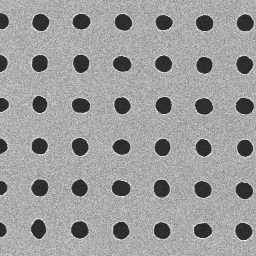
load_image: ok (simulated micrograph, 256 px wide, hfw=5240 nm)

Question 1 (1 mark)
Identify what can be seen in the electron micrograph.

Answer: a regular array of holes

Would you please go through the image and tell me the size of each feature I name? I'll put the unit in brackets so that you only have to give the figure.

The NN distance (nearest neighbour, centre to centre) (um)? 0.835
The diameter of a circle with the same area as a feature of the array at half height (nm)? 344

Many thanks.